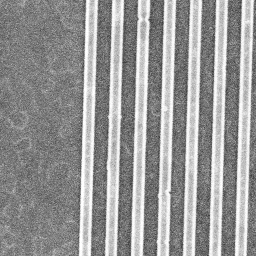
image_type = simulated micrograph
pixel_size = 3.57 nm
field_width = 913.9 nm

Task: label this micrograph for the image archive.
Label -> parallel lines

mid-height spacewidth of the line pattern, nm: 59.7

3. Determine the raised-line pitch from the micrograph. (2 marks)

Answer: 0.0927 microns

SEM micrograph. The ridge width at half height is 31.2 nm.